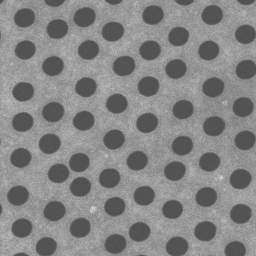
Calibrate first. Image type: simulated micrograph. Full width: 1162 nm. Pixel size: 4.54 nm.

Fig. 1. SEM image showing a regular array of holes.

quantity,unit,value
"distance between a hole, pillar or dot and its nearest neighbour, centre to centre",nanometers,144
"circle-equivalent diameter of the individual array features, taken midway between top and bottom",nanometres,92.9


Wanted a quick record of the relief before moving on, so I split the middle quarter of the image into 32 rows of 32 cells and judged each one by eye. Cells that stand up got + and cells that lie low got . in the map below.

++++++++++++......+++++++......+
++++++++++++.....++++++++......+
+++++++++++++....+++++++++....++
+++++..+++++++++++++...++++..+++
+++.....+++++++++++.....++++++++
+++.....++++++++++......++++++++
+++.....+++++++++++.....++++++++
+++....++++++.+++++....+++++++++
+++++++++++....+++++++++++++++++
+++++++++++.....++++++++++++....
++++++++++......+++++++++++.....
+++++++++++....++++++++++++.....
+++....+++++++++++++..+++++.....
++......++++++++++.....+++++...+
++......++++++++++.....+++++++++
++.....+++++++++++.....+++++++++
++++..++++++..+++++...++++++++++
++++++++++.....+++++++++++++++++
++++++++++.....+++++++++++++...+
++++++++++.....++++++++++++.....
++++++++++....+++++++++++++.....
+++++++++++++++++++++++++++.....
+++..++++++++++++...++++++++...+
++....++++++++++.....+++++++++++
+.....++++++++++.....++++++..+++
......++++++++++....+++++.....++
.+...+++++...++++..++++++.....++
.++++++++.....+++++++++++.....++
.++..++++.....++++++++++++...+++
++....+++.....++++++++++++++++++
++.....+++...+++++++.+++++++++++
+......+++++++++++....++++++++++